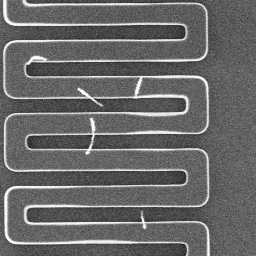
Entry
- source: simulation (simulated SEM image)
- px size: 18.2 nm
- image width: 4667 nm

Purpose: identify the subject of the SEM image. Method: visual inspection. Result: groups of lines, slits or small figures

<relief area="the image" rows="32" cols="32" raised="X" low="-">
-XX----------------XXXXXX-------
-XXXXXXXXXXXXXXXXXXXXXXXXX------
-XXXXXXXXXXXXXXXXXXXXXXXXX------
-----------------------XXX------
-----------------------XXX------
-XXXXXXXXXXXXXXXXXXXXXXXXX------
XXXXXXXXXXXXXXXXXXXXXXXXXX------
XXXXXXXXXXXXXXXXXXXXXXX---------
XXX-----------------------------
XXXX----------------------------
XXXXXXXXXXXXXXXXXXXXXXXXXX------
-XXXXXXXXXXXXXXXXXXXXXXXXX------
-----------------------XXX------
-----------------------XXX------
-XXXXXXXXXXXXXXXXXXXXXXXXX------
-XXXXXXXXXXXXXXXXXXXXXXXXX------
-XXXXXXXXXXXXXXXXXXXXXXXX-------
-XX-----------------------------
-XXX----------------------------
-XXXXXXXXXXXXXXXXXXXXXXXXX------
-XXXXXXXXXXXXXXXXXXXXXXXXX------
-----------------------XXX------
-----------------------XXX------
-XXXXXXXXXXXXXXXXXXXXXXXXX------
-XXXXXXXXXXXXXXXXXXXXXXXXX------
-XXXXXXXXXXXXXXXXXXXXXXXX-------
-XX-----------------------------
-XX-----------------------------
-XXXXXXXXXXXXXXXXXXXXXXXXX------
-XXXXXXXXXXXXXXXXXXXXXXXXX------
-----------------------XXX------
-----------------------XXX------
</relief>